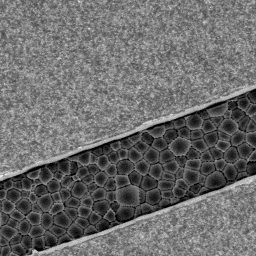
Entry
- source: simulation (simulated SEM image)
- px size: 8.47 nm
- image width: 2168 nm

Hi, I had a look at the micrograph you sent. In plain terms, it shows one or a few lines or trenches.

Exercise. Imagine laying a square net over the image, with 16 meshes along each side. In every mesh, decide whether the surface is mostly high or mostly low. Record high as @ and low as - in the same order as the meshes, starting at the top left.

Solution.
@@@@@@@@@@@@@@@@
@@@@@@@@@@@@@@@@
@@@@@@@@@@@@@@@@
@@@@@@@@@@@@@@@@
@@@@@@@@@@@@@@@@
@@@@@@@@@@@@@@@@
@@@@@@@@@@@@@---
@@@@@@@@@@------
@@@@@@@@--------
@@@@@-----------
@@--------------
---------------@
------------@@@@
---------@@@@@@@
-------@@@@@@@@@
----@@@@@@@@@@@@